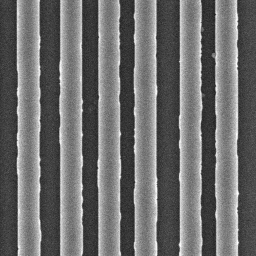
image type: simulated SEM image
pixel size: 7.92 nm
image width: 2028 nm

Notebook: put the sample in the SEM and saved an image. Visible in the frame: lines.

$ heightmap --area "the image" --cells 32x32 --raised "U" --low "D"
DDUUUDDDUUDDUUUDDUUDDDDUUDDUUUDD
DDUUUDDDUUDDUUUDDUUDDDDUUDDUUUDD
DDUUUDDDUUDDUUUDDUUDDDDUUDDUUUDD
DDUUUDDDUUDDUUUDDUUDDDDUUDDUUUDD
DDUUUDDDUUDDUUUDDUUDDDDUUDDUUUDD
DDUUUDDDUUDDUUUDDUUDDDDUUDDUUUDD
DDUUUDDDUUDDUUUDDUUDDDDUUDDUUUDD
DDUUUDDDUUDDUUUDDUUDDDDUUDDUUUDD
DDUUUDDDUUDDUUUDDUUDDDDUUDDUUUDD
DDUUUDDDUUDDUUUDDUUDDDDUUDDUUUDD
DDUUUDDDUUDDUUUDDUUUDDDUUDDUUUDD
DDUUUDDDUUDDUUUDDUUUDDDUUDDUUUDD
DDUUUDDDUUDDUUUDDUUDDDDUUDDUUUDD
DDUUUDDDUUDDUUUDDUUDDDDUUDDUUUDD
DDUUUDDDUUDDUUUDDUUDDDUUUDDUUUDD
DDUUUDDDUUDDUUUDDUUDDDUUUDDUUUDD
DDUUUDDDUUDDUUUDDUUDDDDUUDDUUUDD
DDUUUDDDUUDDUUUDDUUDDDUUUDDUUUDD
DDUUUDDDUUDDUUUDDUUDDDUUUDDUUUDD
DDUUUDDDUUDDUUUDDUUDDDDUUDDUUUDD
DDUUUDDDUUDDUUUDDUUDDDDUUDDUUUDD
DDUUUDDDUUDDUUUDDUUDDDUUUDDUUUDD
DDUUUDDDUUDDUUUDDUUUDDUUUDDUUUDD
DDUUUDDDUUDDUUUDDUUUDDDUUDDUUUDD
DDUUUDDDUUDDUUUDDUUUDDDUUDDUUUDD
DDUUUDDDUUDDUUUDDUUUDDDUUDDUUUDD
DDUUUDDDUUDDUUUDDUUUDDDUUDDUUUDD
DDUUUDDDUUDDUUUDDUUUDDDUUDDUUUDD
DDUUUDDDUUDDUUUDDUUDDDDUUDDUUUDD
DDUUUDDDUUDDUUUDDUUDDDDUUDDUUUDD
DDUUUDDDUUDDUUUDDUUUDDUUUDDUUUDD
DDUUUDDDUUDDUUUDDUUUDDUUUDDUUUDD